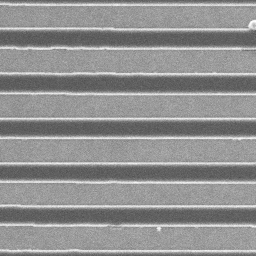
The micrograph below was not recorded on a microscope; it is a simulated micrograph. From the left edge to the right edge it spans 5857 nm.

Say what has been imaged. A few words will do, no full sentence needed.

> lines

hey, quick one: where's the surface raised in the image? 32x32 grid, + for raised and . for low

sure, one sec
++++++++++++++++++++++++++++++++
................................
................................
...............................+
++++++++++++++++++++++++++++++++
++++++++++++++++++++++++++++++++
................................
................................
................................
++++++++++++++++++++++++++++++++
++++++++++++++++++++++++++++++++
++++++++++++++++++++++++++++++++
................................
................................
................................
++++++++++++++++++++++++++++++++
++++++++++++++++++++++++++++++++
................................
................................
................................
++++++++++++++++++++++++++++++++
++++++++++++++++++++++++++++++++
++++++++++++++++++++++++++++++++
................................
................................
................................
++++++++++++++++++++++++++++++++
++++++++++++++++++++++++++++++++
................................
................................
................................
++++++++++++++++++++++++++++++++